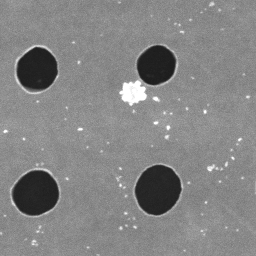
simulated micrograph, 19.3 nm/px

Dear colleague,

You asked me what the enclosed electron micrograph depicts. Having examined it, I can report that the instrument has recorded holes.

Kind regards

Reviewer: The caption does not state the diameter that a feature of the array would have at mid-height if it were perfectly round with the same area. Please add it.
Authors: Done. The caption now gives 852 nm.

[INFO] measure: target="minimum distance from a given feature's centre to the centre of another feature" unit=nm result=2330